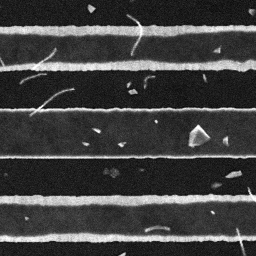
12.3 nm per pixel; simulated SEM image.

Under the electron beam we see lines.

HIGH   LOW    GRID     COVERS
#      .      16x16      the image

................
................
################
################
................
................
................
################
################
################
................
................
###..###.#######
################
################
................